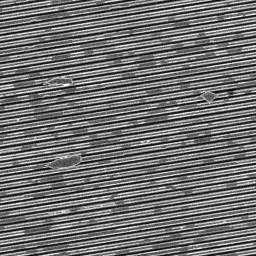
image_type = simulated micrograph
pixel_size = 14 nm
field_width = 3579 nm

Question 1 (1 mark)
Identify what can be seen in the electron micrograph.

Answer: parallel lines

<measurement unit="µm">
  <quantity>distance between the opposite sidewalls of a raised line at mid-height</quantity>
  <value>0.0655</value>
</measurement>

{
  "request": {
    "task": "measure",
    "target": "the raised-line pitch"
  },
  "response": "6.95 pixels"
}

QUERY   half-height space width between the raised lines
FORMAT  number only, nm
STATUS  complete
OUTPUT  39.7